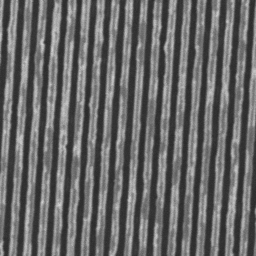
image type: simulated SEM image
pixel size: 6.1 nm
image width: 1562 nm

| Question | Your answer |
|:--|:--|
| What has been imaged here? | parallel lines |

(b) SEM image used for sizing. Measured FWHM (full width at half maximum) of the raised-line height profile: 41.8 nanometres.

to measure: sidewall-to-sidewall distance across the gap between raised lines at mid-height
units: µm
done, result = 0.0418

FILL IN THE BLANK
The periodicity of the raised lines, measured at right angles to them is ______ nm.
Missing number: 87.7